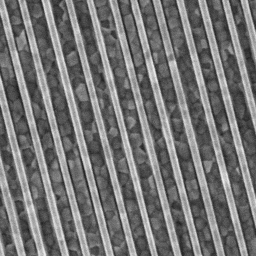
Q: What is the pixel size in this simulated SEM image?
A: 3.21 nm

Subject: parallel lines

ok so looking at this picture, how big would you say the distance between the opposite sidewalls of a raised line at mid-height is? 19.5 nm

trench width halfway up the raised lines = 49.8 nm